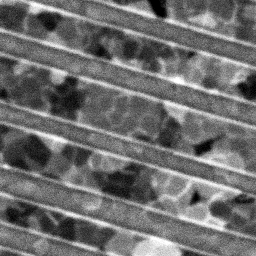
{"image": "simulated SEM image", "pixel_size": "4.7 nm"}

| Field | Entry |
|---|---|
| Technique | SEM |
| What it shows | one or a few lines or trenches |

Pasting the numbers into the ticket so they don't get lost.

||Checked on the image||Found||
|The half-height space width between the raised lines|89.4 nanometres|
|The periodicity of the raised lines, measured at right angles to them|291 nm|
